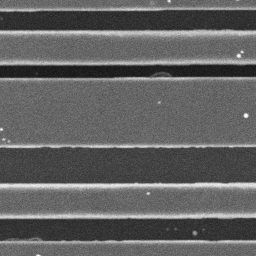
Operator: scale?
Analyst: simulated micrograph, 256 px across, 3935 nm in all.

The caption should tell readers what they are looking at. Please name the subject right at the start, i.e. lines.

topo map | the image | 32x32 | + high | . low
++++++++++++++++++++++++++++++++
................................
................................
................................
++++++++++++++++++++++++++++++++
++++++++++++++++++++++++++++++++
++++++++++++++++++++++++++++++++
++++++++++++++++++++++++++++++++
................................
................................
++++++++++++++++++++++++++++++++
++++++++++++++++++++++++++++++++
++++++++++++++++++++++++++++++++
++++++++++++++++++++++++++++++++
++++++++++++++++++++++++++++++++
++++++++++++++++++++++++++++++++
++++++++++++++++++++++++++++++++
++++++++++++++++++++++++++++++++
................................
................................
................................
................................
................................
++++++++++++++++++++++++++++++++
++++++++++++++++++++++++++++++++
++++++++++++++++++++++++++++++++
++++++++++++++++++++++++++++++++
................................
................................
................................
++++++++++++++++++++++++++++++++
++++++++++++++++++++++++++++++++